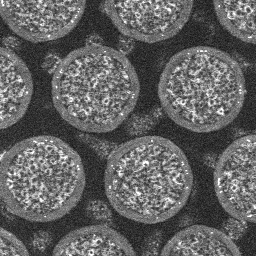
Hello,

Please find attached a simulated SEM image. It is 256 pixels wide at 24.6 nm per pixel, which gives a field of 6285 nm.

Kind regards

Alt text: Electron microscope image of raised bodies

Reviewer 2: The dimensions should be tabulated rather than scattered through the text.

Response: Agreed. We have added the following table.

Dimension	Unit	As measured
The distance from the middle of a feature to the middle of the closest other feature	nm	2580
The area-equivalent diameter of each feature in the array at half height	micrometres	1.95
